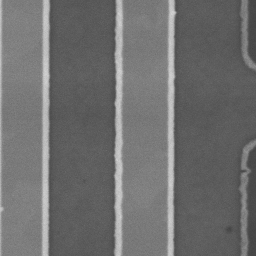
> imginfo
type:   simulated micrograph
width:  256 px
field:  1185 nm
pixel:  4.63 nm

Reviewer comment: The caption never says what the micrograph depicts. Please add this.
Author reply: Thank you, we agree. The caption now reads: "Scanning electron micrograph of one or a few lines or trenches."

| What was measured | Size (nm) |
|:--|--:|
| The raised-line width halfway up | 240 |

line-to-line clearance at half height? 0.338 microns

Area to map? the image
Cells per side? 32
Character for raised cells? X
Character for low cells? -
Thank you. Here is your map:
XXXXXX---------XXXXXX----------X
XXXXXX---------XXXXXXX---------X
XXXXXX---------XXXXXX----------X
XXXXXX---------XXXXXX----------X
XXXXXX---------XXXXXX----------X
XXXXXX---------XXXXXX----------X
XXXXXX---------XXXXXX----------X
XXXXXX---------XXXXXX----------X
XXXXXX---------XXXXXX-----------
XXXXXX---------XXXXXX-----------
XXXXXX---------XXXXXX-----------
XXXXXX---------XXXXXX-----------
XXXXXX---------XXXXXX-----------
XXXXXX---------XXXXXX-----------
XXXXXX---------XXXXXX-----------
XXXXXX---------XXXXXX-----------
XXXXXX---------XXXXXX-----------
XXXXXX---------XXXXXX-----------
XXXXXX---------XXXXXX----------X
XXXXXX---------XXXXXX----------X
XXXXXX---------XXXXXX---------XX
XXXXXX---------XXXXXX----------X
XXXXXX---------XXXXXX----------X
XXXXXX---------XXXXXX---------XX
XXXXXX---------XXXXXX----------X
XXXXXX---------XXXXXX---------XX
XXXXXX---------XXXXXX----------X
XXXXXX---------XXXXXX---------XX
XXXXXX---------XXXXXX---------XX
XXXXXX---------XXXXXX----------X
XXXXXX---------XXXXXX----------X
XXXXXX---------XXXXXX----------X